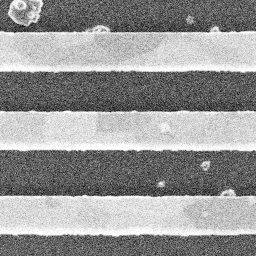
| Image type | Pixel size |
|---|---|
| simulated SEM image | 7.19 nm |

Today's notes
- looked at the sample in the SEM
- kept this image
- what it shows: lines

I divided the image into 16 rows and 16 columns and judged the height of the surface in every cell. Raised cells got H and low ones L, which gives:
LHLLLLLLLLLLLLLL
LLLLLLLLLLLLLLLL
HHHHHHHHHHHHHHHH
HHHHHHHHHHHHHHHH
LLLLLLLLLLLLLLLL
LLLLLLLLLLLLLLLL
LLLLLLLLLLLLLLLL
HHHHHHHHHHHHHHHH
HHHHHHHHHHHHHHHH
LLLLLLLLLLLLLLLL
LLLLLLLLLLLLLLLL
LLLLLLLLLLLLLLLL
HHHHHHHHHHHHHHHH
HHHHHHHHHHHHHHHH
LLHHHHHHHLHHHHHH
LLLLLLLLLLLLLLLL